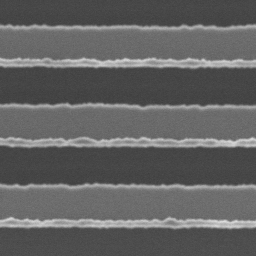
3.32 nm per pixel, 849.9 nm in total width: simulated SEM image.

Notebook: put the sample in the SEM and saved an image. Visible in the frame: lines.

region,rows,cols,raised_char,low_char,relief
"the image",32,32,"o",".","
................................
................................
................................
oooooooooooooooooooooooooooooooo
oooooooooooooooooooooooooooooooo
oooooooooooooooooooooooooooooooo
oooooooooooooooooooooooooooooooo
oooooooooooooooooooooooooooooooo
................................
................................
................................
................................
................................
oooooooooooooooooooooooooooooooo
oooooooooooooooooooooooooooooooo
oooooooooooooooooooooooooooooooo
oooooooooooooooooooooooooooooooo
oooooooooooooooooooooooooooooooo
................................
................................
................................
................................
................................
oooooooooooooooooooooooooooooooo
oooooooooooooooooooooooooooooooo
oooooooooooooooooooooooooooooooo
oooooooooooooooooooooooooooooooo
oooooooooooooooooooooooooooooooo
................................
................................
................................
................................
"